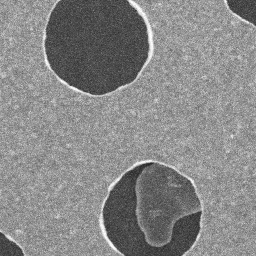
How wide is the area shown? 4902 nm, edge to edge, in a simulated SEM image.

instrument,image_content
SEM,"holes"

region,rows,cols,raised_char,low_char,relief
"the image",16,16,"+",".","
+++......+++++..
+++......+++++++
+++......+++++++
+++......+++++++
+++......+++++++
+++++...++++++++
++++++++++++++++
++++++++++++++++
++++++++++++++++
++++++++++++++++
++++++++...+++++
+++++++.....++++
+++++++.....++++
++++++.......+++
+++++++.....++++
.++++++.....++++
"